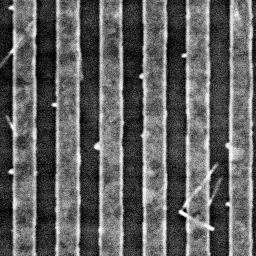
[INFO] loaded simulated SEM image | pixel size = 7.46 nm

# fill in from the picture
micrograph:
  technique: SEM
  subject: lines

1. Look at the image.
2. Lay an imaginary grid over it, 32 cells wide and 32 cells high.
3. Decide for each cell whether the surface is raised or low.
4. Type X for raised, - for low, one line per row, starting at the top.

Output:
--XX---XXX---XX---XXX--XXX---XX-
--XX---XXX---XX---XXX--XXX---XX-
--XX---XXX---XX---XXX--XXX---XX-
--XX---XXX---XX---XXX--XXX---XX-
--XX---XXX---XX---XXX--XXX---XX-
--XX---XXX---XX---XXX--XXX---XX-
--XX---XXX---XX---XXX--XXX---XX-
--XX---XXX---XX---XXX--XXX---XX-
--XX---XXX---XX---XXX--XXX---XX-
--XX---XXX---XX---XXX--XXX---XX-
--XX---XXX---XX---XXX--XXX---XX-
--XX---XXX---XX---XXX--XXX---XX-
--XX---XXX---XX---XXX--XXX---XX-
--XX---XXX---XX---XXX--XXX---XX-
--XX---XXX---XX---XXX--XXX---XX-
--XX---XXX---XX---XXX--XXX---XX-
--XX---XXX---XX---XXX--XXX---XX-
--XX---XXX--XXX---XXX--XXX---XX-
--XX---XXX--XXX---XXX--XXX---XX-
--XX---XXX---XX---XXX--XXX---XX-
--XX---XXX---XX---XXX--XXX---XX-
-XXX---XXX---XX---XXX--XXX---XX-
--XX---XXX---XX---XXX--XXX---XX-
--XX---XXX---XX---XXX--XXX---XX-
--XX---XXX---XX---XXX--XXX---XX-
--XX---XXX---XX---XXX--XXX---XX-
--XX---XXX---XX---XXX--XXX---XX-
--XX---XXX---XX---XXX--XXX---XX-
--XX---XXX---XX---XXX--XXX---XX-
--XX---XXX---XX---XXX--XXX---XX-
--XX---XXX---XX---XXX--XXX---XX-
--XX---XXX---XX---XXX--XXX---XX-